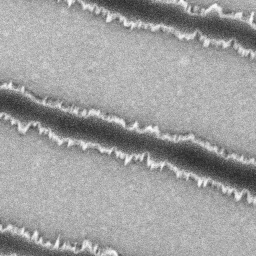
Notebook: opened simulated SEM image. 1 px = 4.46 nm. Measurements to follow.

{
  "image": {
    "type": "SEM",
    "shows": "one or a few lines or trenches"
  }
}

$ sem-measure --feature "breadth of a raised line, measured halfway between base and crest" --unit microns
0.151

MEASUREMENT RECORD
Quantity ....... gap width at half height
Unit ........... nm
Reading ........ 439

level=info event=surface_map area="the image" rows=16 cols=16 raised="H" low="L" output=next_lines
LLLLLLHHHHHHLLLL
LLLLLLLLHHHHHHHH
LLLLLLLLLLLLLHHH
LLLLLLLLLLLLLLLL
LLLLLLLLLLLLLLLL
HLLLLLLLLLLLLLLL
HHHLLLLLLLLLLLLL
LHHHHHHLLLLLLLLL
LLLHHHHHHHLLLLLL
LLLLLLLHHHHHHHLL
LLLLLLLLLLLHHHHH
LLLLLLLLLLLLLHHH
LLLLLLLLLLLLLLLL
LLLLLLLLLLLLLLLL
HLLLLLLLLLLLLLLL
HHHHHHLLLLLLLLLL